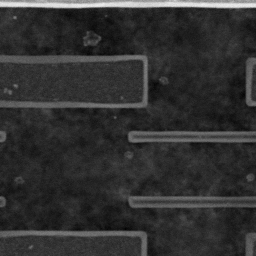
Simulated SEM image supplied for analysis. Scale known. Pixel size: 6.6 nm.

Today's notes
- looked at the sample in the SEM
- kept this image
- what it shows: wiring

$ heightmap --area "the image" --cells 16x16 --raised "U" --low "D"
DDDDDDDDDDDDDDDD
DDDDDDDDDDDDDDDD
DDDDDDDDDDDDDDDD
DDDDDDDDDDDDDDDD
UUUUUUUUUDDDDDDD
UUUUUUUUUDDDDDDD
UUUUUUUUUDDDDDDD
DDDDDDDDDDDDDDDD
DDDDDDDDDDDDDDDD
DDDDDDDDDDDDDDDD
DDDDDDDDDDDDDDDD
DDDDDDDDDDDDDDDD
DDDDDDDDDDDDDDDD
DDDDDDDDDDDDDDDD
DDDDDDDDDDDDDDDD
UUUUUUUUUDDDDDDD